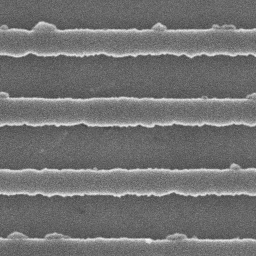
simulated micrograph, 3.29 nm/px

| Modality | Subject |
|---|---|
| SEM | lines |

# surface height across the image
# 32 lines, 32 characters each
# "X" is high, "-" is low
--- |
--------------------------------
--------------------------------
--------------------------------
----XXX------------XX-----------
XXXXXXXXXXXXXXXXXXXXXXXXXXXXXXXX
XXXXXXXXXXXXXXXXXXXXXXXXXXXXXXXX
XXXXXXXXXXXXXXXXXXXXXXXXXXXXXXXX
--------------------------------
--------------------------------
--------------------------------
--------------------------------
--------------------------------
XXXXXXXXXXXXXXXXXXXXXXXXXXXXXXXX
XXXXXXXXXXXXXXXXXXXXXXXXXXXXXXXX
XXXXXXXXXXXXXXXXXXXXXXXXXXXXXXXX
XXXXXXXXX--XXXXXXXXXX--XXXXXX--X
--------------------------------
--------------------------------
--------------------------------
--------------------------------
--------------------------------
XXXXXXXXXXXXXXXXXXXXXXXXXXXXXXXX
XXXXXXXXXXXXXXXXXXXXXXXXXXXXXXXX
XXXXXXXXXXXXXXXXXXXXXXXXXXXXXXXX
------X-X-----X-----------------
--------------------------------
--------------------------------
--------------------------------
--------------------------------
-XX---XX--------------X---------
XXXXXXXXXXXXXXXXXXXXXXXXXXXXXXXX
XXXXXXXXXXXXXXXXXXXXXXXXXXXXXXXX